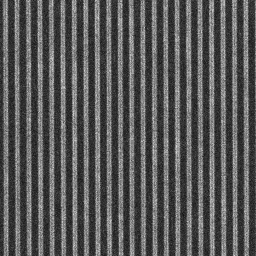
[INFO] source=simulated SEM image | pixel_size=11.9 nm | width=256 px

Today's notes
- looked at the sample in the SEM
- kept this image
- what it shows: parallel lines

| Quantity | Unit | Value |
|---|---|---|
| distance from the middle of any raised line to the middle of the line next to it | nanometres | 136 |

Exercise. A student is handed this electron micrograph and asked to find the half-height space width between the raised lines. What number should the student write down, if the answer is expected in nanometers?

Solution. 87.5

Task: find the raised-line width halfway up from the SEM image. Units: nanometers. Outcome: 44.5